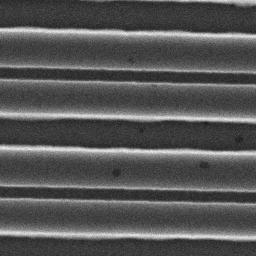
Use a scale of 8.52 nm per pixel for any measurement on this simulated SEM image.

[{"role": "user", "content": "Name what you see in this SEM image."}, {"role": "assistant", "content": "lines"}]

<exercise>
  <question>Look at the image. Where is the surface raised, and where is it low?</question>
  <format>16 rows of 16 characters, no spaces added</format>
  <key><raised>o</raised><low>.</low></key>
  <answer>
................
................
oooooooooooooooo
oooooooooooooooo
oooooooooooooooo
oooooooooooooooo
oooooooooooooooo
..............oo
................
ooooooooooooo...
oooooooooooooooo
oooooooooooooooo
oooooooooooooooo
oooooooooooooooo
oooooooooooooooo
................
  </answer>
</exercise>